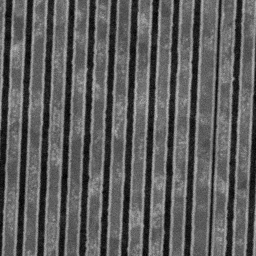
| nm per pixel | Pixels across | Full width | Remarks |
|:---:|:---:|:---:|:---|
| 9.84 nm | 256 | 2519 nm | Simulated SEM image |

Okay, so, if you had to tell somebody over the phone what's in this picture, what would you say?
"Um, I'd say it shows parallel lines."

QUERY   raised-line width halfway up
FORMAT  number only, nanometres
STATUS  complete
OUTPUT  119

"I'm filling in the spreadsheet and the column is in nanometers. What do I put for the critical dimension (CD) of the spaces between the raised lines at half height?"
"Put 82.3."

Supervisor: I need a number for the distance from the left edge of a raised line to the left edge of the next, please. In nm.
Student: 206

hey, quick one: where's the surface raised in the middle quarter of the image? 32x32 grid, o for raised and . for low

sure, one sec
..ooo...ooo..ooo..ooo..ooo...ooo
...oo..oooo..ooo..ooo..ooo...ooo
..ooo..ooo...ooo..ooo..ooo...ooo
..ooo...oo...ooo..ooo..ooo..oooo
..ooo...oo...ooo..ooo..ooo...oo.
..ooo...oo...ooo..ooo..ooo..ooo.
..ooo..ooo...ooo..ooo..ooo..ooo.
..ooo..ooo...ooo..ooo..ooo..ooo.
..ooo..ooo...ooo..ooo..ooo..ooo.
..ooo..ooo...ooo..ooo..ooo..ooo.
..ooo..ooo..ooo...ooo..ooo..ooo.
..ooo..ooo..ooo...ooo..ooo..ooo.
..ooo..ooo...oo...ooo..ooo..ooo.
..ooo..ooo..ooo...oo...ooo..ooo.
..ooo..ooo..ooo...ooo..ooo..ooo.
..ooo..ooo..ooo...oo...ooo..ooo.
..ooo..ooo..ooo...ooo..ooo..ooo.
..ooo..ooo..ooo...ooo..ooo..ooo.
..ooo..ooo..ooo..ooo...ooo..ooo.
..ooo..ooo..ooo..ooo...oo...ooo.
..ooo..ooo..ooo..ooo...ooo..ooo.
..ooo..ooo..ooo..ooo..oooo..ooo.
.ooo...ooo..ooo..ooo..ooo...ooo.
.ooo...ooo..ooo..ooo..ooo...ooo.
.ooo...ooo..ooo..ooo..ooo...ooo.
..oo...oo...ooo..ooo...oo...ooo.
.ooo...oo...ooo..ooo..ooo...oo..
.ooo...oo...ooo..ooo..ooo...oo..
.ooo...oo...ooo..ooo..ooo...ooo.
.ooo...oo...ooo..ooo..ooo..oooo.
.ooo..ooo...ooo..ooo..ooo..ooo..
.ooo..ooo...ooo..ooo..ooo..ooo..